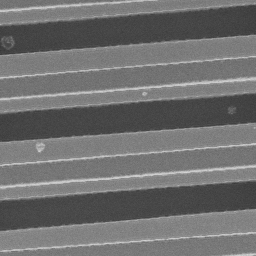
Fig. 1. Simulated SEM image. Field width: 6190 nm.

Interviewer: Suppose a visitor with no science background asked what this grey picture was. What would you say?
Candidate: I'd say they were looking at lines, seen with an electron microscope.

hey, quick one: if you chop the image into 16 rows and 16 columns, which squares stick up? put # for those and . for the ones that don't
#############...
................
............####
################
################
################
#######.........
................
......##########
################
################
############....
................
............####
################
################